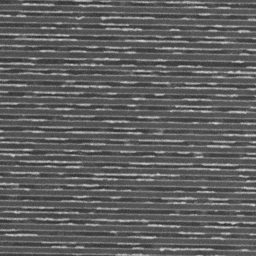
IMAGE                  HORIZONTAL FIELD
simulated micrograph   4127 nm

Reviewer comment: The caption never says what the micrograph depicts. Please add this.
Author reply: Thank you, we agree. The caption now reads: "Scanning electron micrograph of parallel lines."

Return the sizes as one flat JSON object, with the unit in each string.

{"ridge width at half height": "0.0967 µm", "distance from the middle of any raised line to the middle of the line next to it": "0.186 µm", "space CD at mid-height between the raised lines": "90.7 nanometers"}